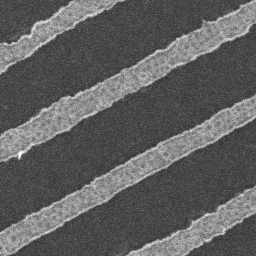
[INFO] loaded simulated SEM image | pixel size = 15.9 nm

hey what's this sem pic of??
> one or a few lines or trenches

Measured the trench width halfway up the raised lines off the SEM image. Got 957 nanometers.